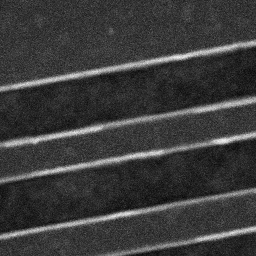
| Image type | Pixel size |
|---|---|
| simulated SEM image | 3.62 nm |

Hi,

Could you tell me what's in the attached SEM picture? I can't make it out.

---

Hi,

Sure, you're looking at one or a few lines or trenches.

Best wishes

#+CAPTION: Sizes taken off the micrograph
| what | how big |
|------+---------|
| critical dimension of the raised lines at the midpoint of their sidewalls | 139 nm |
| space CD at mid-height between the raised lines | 188 nanometres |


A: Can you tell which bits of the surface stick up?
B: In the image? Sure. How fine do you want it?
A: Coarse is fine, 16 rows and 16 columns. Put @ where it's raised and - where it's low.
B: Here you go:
@@@@@@@@@@@@@@@@
@@@@@@@@@@@@@@@@
@@@@@@@@@@@@@@@@
@@@@@@@@@@@@----
@@@@@@----------
@---------------
--------------@@
---------@@@@@@@
---@@@@@@@@@@@@@
@@@@@@@@@@@-----
@@@@@-----------
----------------
------------@@@@
-------@@@@@@@@@
-@@@@@@@@@@@@@@@
@@@@@@@@@@------